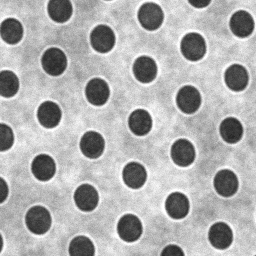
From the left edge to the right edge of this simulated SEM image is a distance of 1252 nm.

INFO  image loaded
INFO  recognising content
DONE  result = a regular array of holes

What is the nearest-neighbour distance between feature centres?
257 nm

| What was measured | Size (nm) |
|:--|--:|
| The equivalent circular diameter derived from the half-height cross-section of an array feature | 134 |